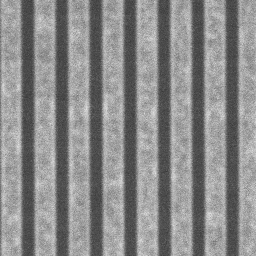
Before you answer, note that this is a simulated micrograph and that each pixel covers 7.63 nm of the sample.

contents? parallel lines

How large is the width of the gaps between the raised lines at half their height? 111 nm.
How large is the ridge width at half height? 19 pixels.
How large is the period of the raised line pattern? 0.26 micrometres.